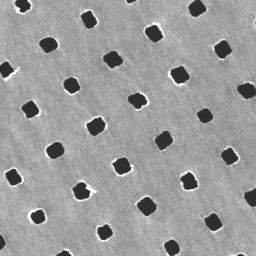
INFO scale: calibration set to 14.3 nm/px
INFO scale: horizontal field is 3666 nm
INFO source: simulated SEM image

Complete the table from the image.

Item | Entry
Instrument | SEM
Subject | a regular array of holes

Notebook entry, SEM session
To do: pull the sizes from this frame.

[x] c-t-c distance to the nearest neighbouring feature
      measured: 678 nanometers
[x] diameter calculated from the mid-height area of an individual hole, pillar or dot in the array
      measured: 240 nm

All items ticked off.